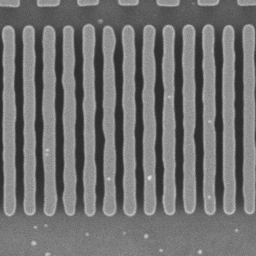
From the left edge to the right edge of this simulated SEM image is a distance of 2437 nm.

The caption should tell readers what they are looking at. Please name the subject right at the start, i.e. groups of lines, slits or small figures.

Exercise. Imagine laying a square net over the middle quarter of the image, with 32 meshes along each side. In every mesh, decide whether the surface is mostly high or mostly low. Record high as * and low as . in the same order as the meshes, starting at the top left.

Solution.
***..**...**...***..***..***..**
**...**...***..***..***..***..**
**...**...***..***..***..**...**
***..**...***..**...***..**...**
***..**...***..***..***..**...**
***..**...***..***..**...**...**
***..**...***..***..**...***..**
***..**...***..***..**...**...**
***..***..***..***..**...**...**
***..***..***..***..**...**...**
***..***..***..***..**...**...**
***..***..***..***..**...**...**
***..***..***..***..**...***..**
***..**...***..***..***..***..**
***..**...***..***..***..***..**
***..**...***..***..***..***..**
***..**...***..**...***..***..**
***..***..***..**...***..***..**
***..***..***..***..***..***..**
***..***..***..***..***..***..**
***..***..***..***..**...***..**
***..***..***..***..**...***..**
***..**...***..***..***..***..**
***..**...***..***..***..***..**
***..***..***..***..***..***..**
***..***..***..***..***..***..**
***..***..***..***..***..***..**
***..***..***..***..***..***..**
***..***..***..***..***..***..**
***..***..***..***..***..***..**
***..***..***..***..***..***..**
***..***..***..***..***..***..**